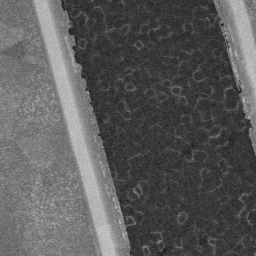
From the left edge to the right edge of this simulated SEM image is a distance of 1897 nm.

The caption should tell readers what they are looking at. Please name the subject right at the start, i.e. one or a few lines or trenches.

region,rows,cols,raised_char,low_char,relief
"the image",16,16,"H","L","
HHHLLLLLLLLLLLLH
HHHLLLLLLLLLLLLH
HHHLLLLLLLLLLLLH
HHHHLLLLLLLLLLLL
HHHHLLLLLLLLLLLL
HHHHLLLLLLLLLLLL
HHHHLLLLLLLLLLLL
HHHHHLLLLLLLLLLL
HHHHHLLLLLLLLLLL
HHHHHLLLLLLLLLLL
HHHHHLLLLLLLLLLL
HHHHHHLLLLLLLLLL
HHHHHHLLLLLLLLLL
HHHHHHLLLLLLLLLL
HHHHHHHLLLLLLLLL
HHHHHHHLLLLLLLLL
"